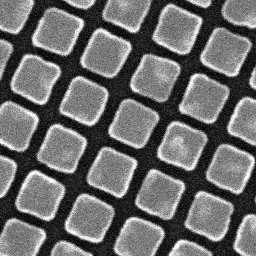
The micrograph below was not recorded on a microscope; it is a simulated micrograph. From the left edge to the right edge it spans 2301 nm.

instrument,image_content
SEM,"a regular array of raised bodies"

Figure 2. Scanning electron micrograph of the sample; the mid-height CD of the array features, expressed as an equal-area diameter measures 0.404 microns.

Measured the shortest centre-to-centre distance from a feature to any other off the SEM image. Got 466 nm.